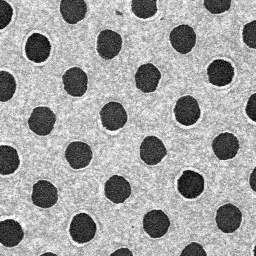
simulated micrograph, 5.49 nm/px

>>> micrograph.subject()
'a regular array of holes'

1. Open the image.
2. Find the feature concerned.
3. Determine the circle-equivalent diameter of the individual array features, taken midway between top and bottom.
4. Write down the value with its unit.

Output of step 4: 156 nanometers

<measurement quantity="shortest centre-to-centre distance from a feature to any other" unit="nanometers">279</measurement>